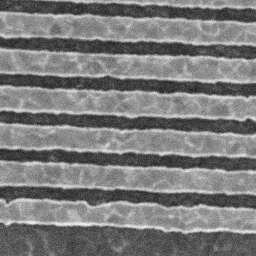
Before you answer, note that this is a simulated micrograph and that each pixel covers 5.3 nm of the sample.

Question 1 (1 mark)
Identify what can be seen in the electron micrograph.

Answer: parallel lines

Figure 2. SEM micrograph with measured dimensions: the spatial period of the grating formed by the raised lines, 198 nanometres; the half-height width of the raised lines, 22.3 pixels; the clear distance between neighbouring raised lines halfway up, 15.1 pixels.